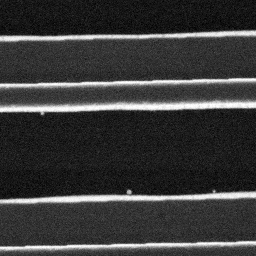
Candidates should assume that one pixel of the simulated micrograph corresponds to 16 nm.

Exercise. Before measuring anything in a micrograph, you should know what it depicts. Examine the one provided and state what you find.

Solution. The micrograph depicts lines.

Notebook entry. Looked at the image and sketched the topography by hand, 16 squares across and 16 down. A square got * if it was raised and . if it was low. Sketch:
................
................
****************
****************
****************
****************
****************
................
................
................
................
................
.......*********
****************
****************
****************